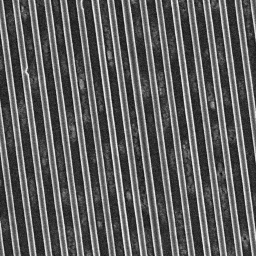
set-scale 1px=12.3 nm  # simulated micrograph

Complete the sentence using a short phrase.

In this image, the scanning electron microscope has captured parallel lines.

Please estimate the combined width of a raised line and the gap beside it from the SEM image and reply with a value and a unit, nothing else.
15.7 pixels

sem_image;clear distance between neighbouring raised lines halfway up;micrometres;0.122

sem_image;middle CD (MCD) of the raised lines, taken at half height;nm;78.1